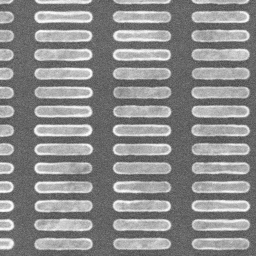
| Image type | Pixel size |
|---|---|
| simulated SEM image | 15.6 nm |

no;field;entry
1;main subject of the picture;groups of lines, slits or small figures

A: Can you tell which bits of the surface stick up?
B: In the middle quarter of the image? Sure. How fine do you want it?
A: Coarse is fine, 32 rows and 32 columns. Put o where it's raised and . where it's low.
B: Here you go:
................................
oooooo.......ooooooooooooo......
ooooooo......ooooooooooooo......
.............oooooooooooo.......
................................
................................
ooooooo......ooooooooooooo......
ooooooo......ooooooooooooo......
................................
................................
................................
oooooo.......ooooooooooooo......
oooooo.......ooooooooooooo......
................................
................................
.............oooooooooo.........
oooooo.......ooooooooooooo......
oooooo.......ooooooooooooo......
................................
................................
oooooo.......ooooooooooooo......
ooooooo......ooooooooooooo......
oooooo.......ooooooooooo........
................................
................................
ooooooo......ooooooooooooo......
ooooooo......oooooooooooooo.....
................................
................................
................................
ooooooo......ooooooooooooo......
ooooooo......ooooooooooooo......